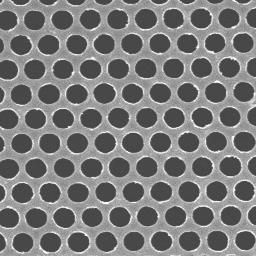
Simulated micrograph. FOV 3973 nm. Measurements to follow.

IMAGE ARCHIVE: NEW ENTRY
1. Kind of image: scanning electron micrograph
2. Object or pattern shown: a regular array of holes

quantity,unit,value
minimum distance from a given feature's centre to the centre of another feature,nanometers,429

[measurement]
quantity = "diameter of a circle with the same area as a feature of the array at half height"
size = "321 nanometers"